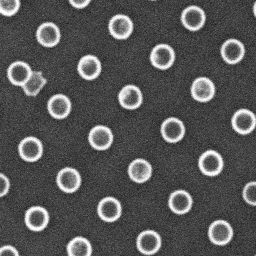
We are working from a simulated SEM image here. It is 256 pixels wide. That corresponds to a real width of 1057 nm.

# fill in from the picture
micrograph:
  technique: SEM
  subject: a regular array of raised bodies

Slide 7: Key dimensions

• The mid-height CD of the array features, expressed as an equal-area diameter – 22.2 pixels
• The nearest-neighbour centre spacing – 204 nm